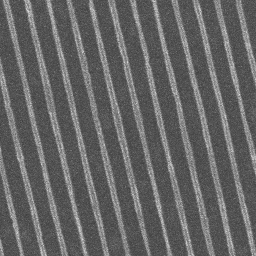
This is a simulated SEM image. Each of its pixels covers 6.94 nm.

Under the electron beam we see parallel lines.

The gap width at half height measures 112 nm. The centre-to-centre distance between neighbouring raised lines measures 0.143 µm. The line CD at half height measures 31.3 nanometers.